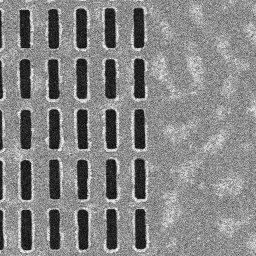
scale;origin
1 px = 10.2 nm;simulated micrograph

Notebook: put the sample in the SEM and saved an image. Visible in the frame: a regular array of holes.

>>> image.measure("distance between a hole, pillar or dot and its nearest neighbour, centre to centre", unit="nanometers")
290